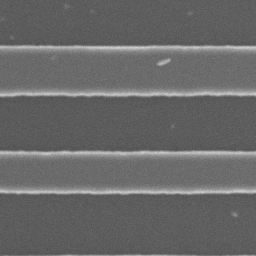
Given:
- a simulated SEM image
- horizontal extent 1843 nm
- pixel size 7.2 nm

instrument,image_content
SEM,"lines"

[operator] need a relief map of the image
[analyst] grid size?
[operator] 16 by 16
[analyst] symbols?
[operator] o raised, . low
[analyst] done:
................
................
................
oooooooooooooooo
oooooooooooooooo
oooooooooooooooo
................
................
................
................
oooooooooooooooo
oooooooooooooooo
................
................
................
................